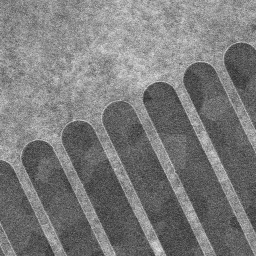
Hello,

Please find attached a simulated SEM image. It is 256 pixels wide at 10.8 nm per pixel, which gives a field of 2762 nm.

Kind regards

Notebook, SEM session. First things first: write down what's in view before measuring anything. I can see parallel lines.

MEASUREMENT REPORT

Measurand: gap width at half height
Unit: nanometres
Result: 98.4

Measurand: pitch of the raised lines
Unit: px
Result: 44.2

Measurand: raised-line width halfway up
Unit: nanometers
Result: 385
